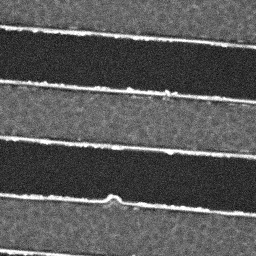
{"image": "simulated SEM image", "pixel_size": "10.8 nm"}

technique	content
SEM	one or a few lines or trenches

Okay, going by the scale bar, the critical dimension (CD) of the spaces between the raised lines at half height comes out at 594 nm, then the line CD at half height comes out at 0.607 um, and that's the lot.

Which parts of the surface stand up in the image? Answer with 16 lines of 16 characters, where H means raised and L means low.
LLLLLLLLLLLLLLLL
LLLLLLLLLLLLLLLL
HHHHHHHHHHHLLLLL
HHHHHHHHHHHHHHHH
HHHHHHHHHHHHHHHH
LLLLLHHHHHHHHHHH
LLLLLLLLLLLLLLLL
LLLLLLLLLLLLLLLL
LLLLLLLLLLLLLLLL
HHHHHHHHHHHHLLLL
HHHHHHHHHHHHHHHH
HHHHHHHHHHHHHHHH
LLLLLHHHHHHHHHHH
LLLLLLLLLLLLLLLL
LLLLLLLLLLLLLLLL
LLLLLLLLLLLLLLLL